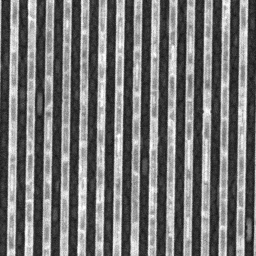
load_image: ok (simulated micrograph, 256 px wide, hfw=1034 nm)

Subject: parallel lines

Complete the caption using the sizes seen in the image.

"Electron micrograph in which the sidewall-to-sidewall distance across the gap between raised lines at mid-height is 40.9 nanometers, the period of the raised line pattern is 0.0711 µm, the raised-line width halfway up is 29.3 nm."